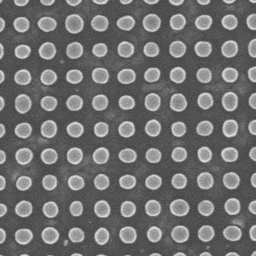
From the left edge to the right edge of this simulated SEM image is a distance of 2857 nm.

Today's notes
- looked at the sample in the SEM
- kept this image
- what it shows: a regular array of raised bodies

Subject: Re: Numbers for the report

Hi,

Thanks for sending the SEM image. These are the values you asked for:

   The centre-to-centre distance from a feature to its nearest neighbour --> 285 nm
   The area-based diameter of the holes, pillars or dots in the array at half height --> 168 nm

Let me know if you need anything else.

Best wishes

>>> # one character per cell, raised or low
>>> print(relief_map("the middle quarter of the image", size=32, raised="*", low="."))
................................
........**.....**....**....***..
.***...****...****..****...***..
.***...****...****..***....***..
..**....**....***...............
................................
................................
................................
.***....***...***...****...***..
.***...****...***...****...***..
.***...****...***....***...***..
............................*...
................................
................................
.....................**.........
.***....***...***....***...***..
.****...***...***...****...***..
.***....**....***....**.....**..
................................
................................
................................
.***....**.....**....**.....**..
.***...****...****...***...****.
.***...****...****...***...***..
..**....**.....**...............
................................
................................
................................
..**....***...***....***...***..
.****...***...****...***...***..
.****...***...***....***....**..
................................